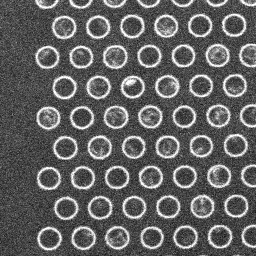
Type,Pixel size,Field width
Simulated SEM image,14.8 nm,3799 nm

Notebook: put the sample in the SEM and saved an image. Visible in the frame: a regular array of raised bodies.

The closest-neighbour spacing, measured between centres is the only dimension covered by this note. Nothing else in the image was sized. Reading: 504 nanometres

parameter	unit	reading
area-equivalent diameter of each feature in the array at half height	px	21.5